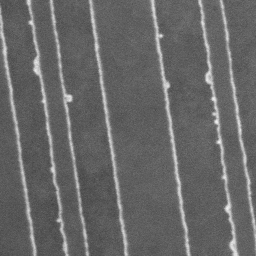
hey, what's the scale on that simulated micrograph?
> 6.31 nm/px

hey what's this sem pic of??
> lines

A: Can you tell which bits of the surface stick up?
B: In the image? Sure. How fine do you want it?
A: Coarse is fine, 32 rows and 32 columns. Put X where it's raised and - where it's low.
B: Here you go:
----XXX----XXXXXXXX------XXX----
----XXX----XXXXXXXX------XXX----
----XXX----XXXXXXXX------XXX----
----XXX-----XXXXXXXX-----XXX----
----XXX-----XXXXXXXX------XX----
X---XXX-----XXXXXXXX------XX----
X----XX-----XXXXXXXX------XXX---
X----XX-----XXXXXXXX------XXX---
X----XXX----XXXXXXXX------XXX---
X----XXX-----XXXXXXXX-----XXX---
X----XXX-----XXXXXXXX-----XXX---
X----XXX-----XXXXXXXX------XX---
XX----XX-----XXXXXXXX------XX---
XX----XX-----XXXXXXXX------XXX--
XX----XXX----XXXXXXXX------XXX--
XX----XXX----XXXXXXXX------XXX--
XX----XXX-----XXXXXXXX-----XXX--
XX----XXX-----XXXXXXXX-----XXX--
XXX---XXX-----XXXXXXXX------XX--
XXX---XXX-----XXXXXXXX------XXX-
XXX---XXX-----XXXXXXXX------XXX-
XXX----XXX----XXXXXXXX------XXX-
XXX----XXX----XXXXXXXX------XXX-
XXX----XXX-----XXXXXXX------XXX-
XXX----XXX-----XXXXXXXX-----XXX-
XXXX---XXX-----XXXXXXXX------XX-
XXXX---XXX-----XXXXXXXX------XXX
XXXX----XX-----XXXXXXXX------XXX
XXXX----XXX----XXXXXXXX------XXX
XXXX----XXX----XXXXXXXX------XXX
XXXX----XXX-----XXXXXXX------XXX
XXXX----XXX-----XXXXXXXX-----XXX